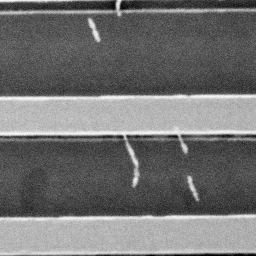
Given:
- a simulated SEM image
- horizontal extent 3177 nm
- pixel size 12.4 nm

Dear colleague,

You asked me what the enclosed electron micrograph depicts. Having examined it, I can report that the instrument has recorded lines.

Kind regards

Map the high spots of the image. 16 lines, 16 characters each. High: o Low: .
................
................
................
................
................
................
oooooooooooooooo
oooooooooooooooo
................
................
................
................
................
...............o
oooooooooooooooo
oooooooooooooooo